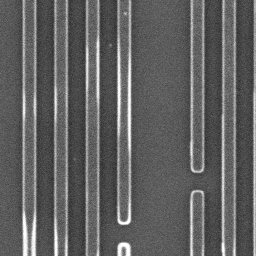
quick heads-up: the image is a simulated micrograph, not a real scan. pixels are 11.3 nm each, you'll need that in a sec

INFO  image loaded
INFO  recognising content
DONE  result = groups of lines, slits or small figures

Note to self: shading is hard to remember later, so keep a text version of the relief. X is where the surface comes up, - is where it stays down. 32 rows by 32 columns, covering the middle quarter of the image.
X-----XX------XX----------------
X-----XX------XX----------------
X-----XX------XX----------------
X-----XX------XX----------------
X-----XX------XX----------------
X-----XX------XX----------------
X-----XX------XX----------------
X-----XX------XX----------------
X-----XX------XX----------------
X-----XXX-----XX----------------
X-----XXX-----XX----------------
X-----XXX-----XX----------------
X-----XXX-----XX----------------
X-----XXX-----XX----------------
X-----XXX-----XX----------------
X-----XXX-----XX----------------
X-----XXX-----XX----------------
X-----XXX-----XX----------------
X-----XXX-----XX----------------
X-----XXX-----XX----------------
X-----XXX-----XX----------------
X-----XXX-----XX----------------
X-----XXX-----XXX---------------
X-----XXX-----XXX---------------
X-----XXX-----XXX---------------
X-----XXX----XXXX---------------
X-----XXX----XXXX---------------
X-----XXX----XXXX---------------
X-----XXX----XXXX---------------
X-----XXX----XXXX---------------
X-----XXX----XXXX---------------
X-----XXX----XXXX---------------